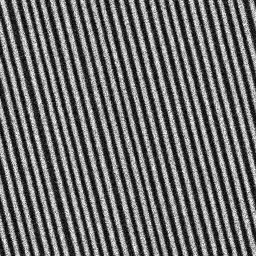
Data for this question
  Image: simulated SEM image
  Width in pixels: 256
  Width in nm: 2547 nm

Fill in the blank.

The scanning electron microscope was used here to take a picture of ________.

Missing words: parallel lines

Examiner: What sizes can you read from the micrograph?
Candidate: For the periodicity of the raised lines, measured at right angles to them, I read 95.3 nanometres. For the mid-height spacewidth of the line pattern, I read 50.6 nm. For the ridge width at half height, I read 43.4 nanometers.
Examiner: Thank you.